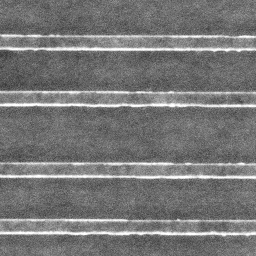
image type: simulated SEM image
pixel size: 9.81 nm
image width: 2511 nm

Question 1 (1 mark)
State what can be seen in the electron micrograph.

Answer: lines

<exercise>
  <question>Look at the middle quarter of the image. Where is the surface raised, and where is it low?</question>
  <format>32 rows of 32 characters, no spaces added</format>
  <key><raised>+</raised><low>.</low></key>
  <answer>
................................
................................
................................
................................
................................
................................
................................
++++++++++++++++++++++++++++++++
++++++++++++++++++++++++++++++++
++++++++++++++++++++++++++++++++
......++++++++...+++.........++.
................................
................................
................................
................................
................................
................................
................................
................................
................................
................................
................................
................................
................................
................................
++++++++++++++++++++++++++++++++
++++++++++++++++++++++++++++++++
++++++++++++++++++++++++++++++++
................................
................................
................................
................................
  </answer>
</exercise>